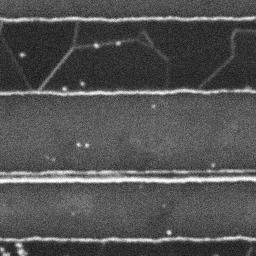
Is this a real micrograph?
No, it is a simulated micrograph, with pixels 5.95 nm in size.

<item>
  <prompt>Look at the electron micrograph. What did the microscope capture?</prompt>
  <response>lines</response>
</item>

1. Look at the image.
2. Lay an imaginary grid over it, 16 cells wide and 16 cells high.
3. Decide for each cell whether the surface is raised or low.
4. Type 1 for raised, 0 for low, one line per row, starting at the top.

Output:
0000000000000000
1111111111111111
1111111111111111
1111111111111111
1111111111111111
1111111111111111
0000000000000000
0000000000000000
0000000000000000
0000000000000000
0000000000000000
0000000000000000
0000000000000000
0000000000000000
0000000000000000
1111111111111111